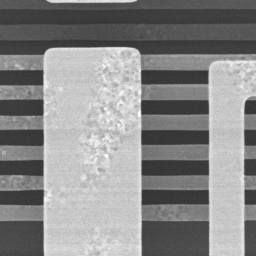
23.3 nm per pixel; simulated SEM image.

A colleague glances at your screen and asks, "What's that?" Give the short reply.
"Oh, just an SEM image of wiring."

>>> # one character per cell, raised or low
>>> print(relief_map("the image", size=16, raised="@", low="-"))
----------------
----------------
----------------
---@@@@@@-------
---@@@@@@----@@@
---@@@@@@----@@@
---@@@@@@----@@-
---@@@@@@----@@-
---@@@@@@----@@-
---@@@@@@----@@-
---@@@@@@----@@-
---@@@@@@----@@-
---@@@@@@----@@-
---@@@@@@----@@-
---@@@@@@----@@-
---@@@@@@----@@-